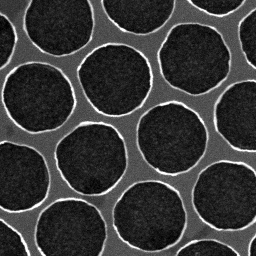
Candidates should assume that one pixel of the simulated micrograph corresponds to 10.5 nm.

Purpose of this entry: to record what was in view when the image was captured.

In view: holes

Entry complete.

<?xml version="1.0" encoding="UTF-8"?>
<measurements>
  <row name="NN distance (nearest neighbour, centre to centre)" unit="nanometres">850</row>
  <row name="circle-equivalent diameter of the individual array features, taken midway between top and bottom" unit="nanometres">736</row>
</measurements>